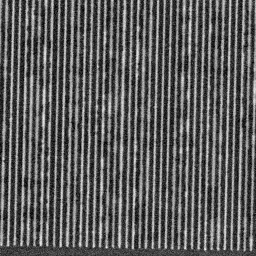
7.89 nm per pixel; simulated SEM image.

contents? parallel lines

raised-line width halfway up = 0.0138 micrometres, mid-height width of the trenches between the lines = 36.5 nm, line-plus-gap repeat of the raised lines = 6.57 pixels